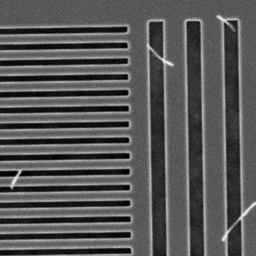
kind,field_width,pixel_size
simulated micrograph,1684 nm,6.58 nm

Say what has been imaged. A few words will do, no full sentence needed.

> groups of lines, slits or small figures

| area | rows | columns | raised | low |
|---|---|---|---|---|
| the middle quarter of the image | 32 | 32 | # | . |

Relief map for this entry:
#####################....#####..
#####################....######.
######..........#####....######.
................#####....######.
#####################....######.
#####################....######.
................#####....######.
................#####....######.
#####################....######.
#####################....######.
#####...........#####....######.
................#####....######.
#####################....######.
#####################....######.
................#####....######.
................#####....######.
#####################....######.
#####################....######.
................#####....######.
................#####....######.
#####################....######.
#####################....######.
................#####....######.
................#####....######.
######################...######.
######################...######.
.................#####...######.
................######...######.
######################....#####.
######################....#####.
................######....#####.
................######....#####.